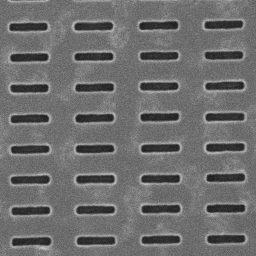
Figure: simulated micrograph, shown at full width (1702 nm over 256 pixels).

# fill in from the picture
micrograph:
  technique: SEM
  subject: a regular array of holes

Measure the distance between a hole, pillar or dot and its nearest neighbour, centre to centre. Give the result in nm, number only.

203